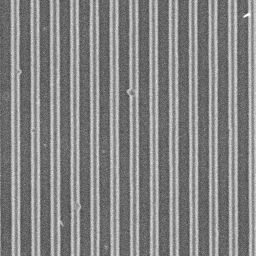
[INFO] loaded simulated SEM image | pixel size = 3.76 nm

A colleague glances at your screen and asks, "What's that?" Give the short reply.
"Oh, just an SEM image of parallel lines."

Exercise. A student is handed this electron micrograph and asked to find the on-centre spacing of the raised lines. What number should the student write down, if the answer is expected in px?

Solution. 19.8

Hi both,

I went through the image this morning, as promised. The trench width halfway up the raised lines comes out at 51.7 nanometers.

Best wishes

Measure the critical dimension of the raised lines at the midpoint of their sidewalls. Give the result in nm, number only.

24